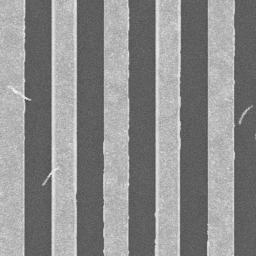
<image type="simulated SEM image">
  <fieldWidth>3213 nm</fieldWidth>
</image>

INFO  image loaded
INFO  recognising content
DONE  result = lines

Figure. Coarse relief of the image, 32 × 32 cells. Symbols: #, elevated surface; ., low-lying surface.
###....###...###....###...###...
###....###...###....###...###...
###....###...###....##....###...
###....###...###....###...###...
###....###...###....###...###...
###....###...###....###...###...
###....###...###....##....###...
###....###...###....###...###...
###....###...###....##....###...
###....###...###....##....###...
###....###...###....##....###...
###....###...###....##....###...
###....##....###....##....###...
###....###...###....##....###...
###....###...###....##....###...
###....##....###....##....###...
###....##....###....##....###...
###....###...###....##....###...
###....##....###....##....###...
###....##....###....##....###...
###....##....###....##....###...
###....###...###....##....###...
###....##....###....##....###...
###....##....###....##....###...
###....##....###....##....###...
###....###...###....##....###...
###....###...###....##....###...
###....###...###....##....###...
###....###...###....##....###...
###....###...###....##....###...
###....###...###....##....###...
###....##....###....##....###...